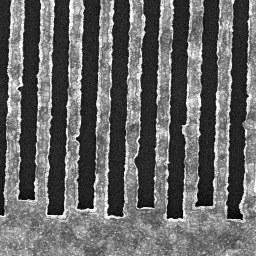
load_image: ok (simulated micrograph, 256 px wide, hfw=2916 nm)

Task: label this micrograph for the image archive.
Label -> parallel lines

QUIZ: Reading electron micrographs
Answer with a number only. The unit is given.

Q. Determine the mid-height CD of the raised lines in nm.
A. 144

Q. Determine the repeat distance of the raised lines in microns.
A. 0.339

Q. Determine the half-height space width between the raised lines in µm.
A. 0.195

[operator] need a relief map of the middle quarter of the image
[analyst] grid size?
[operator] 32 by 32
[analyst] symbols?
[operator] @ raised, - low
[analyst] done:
-@@@-----@@@----@@@-----@@@----@
-@@@-----@@@----@@@-----@@@----@
-@@@-----@@@----@@@-----@@@----@
-@@@-----@@@----@@@-----@@-----@
-@@@-----@@@----@@@----@@@@----@
-@@@-----@@@----@@@----@@@-----@
-@@@-----@@-----@@@-----@@-----@
-@@@----@@@-----@@@-----@@@----@
-@@@----@@@-----@@@----@@@-----@
-@@@----@@@-----@@@----@@@-----@
-@@@----@@@@----@@@----@@@-----@
-@@@-----@@@----@@@----@@@-----@
-@@@-----@@-----@@@----@@@-----@
-@@@-----@@-----@@@----@@@@----@
-@@@----@@@-----@@@----@@@-----@
-@@@----@@@----@@@@----@@@----@@
-@@@----@@@----@@@@----@@@----@@
-@@@----@@@-----@@@----@@@----@@
-@@-----@@@----@@@@----@@@----@@
-@@-----@@@-----@@-----@@@----@@
-@@@----@@@-----@@-----@@@----@@
-@@@----@@@-----@@-----@@@----@@
-@@@----@@@-----@@-----@@@-----@
@@@@----@@@----@@@-----@@@-----@
-@@-----@@@-----@@-----@@@----@@
-@@-----@@@----@@@-----@@@----@@
@@@-----@@@-----@@-----@@@----@@
-@@@----@@@----@@@-----@@@----@@
-@@-----@@@----@@@-----@@@----@@
@@@-----@@@----@@@-----@@@----@@
@@@-----@@@----@@@@----@@@----@@
-@@-----@@@----@@@-----@@@----@@